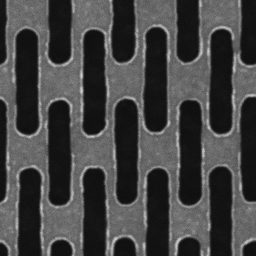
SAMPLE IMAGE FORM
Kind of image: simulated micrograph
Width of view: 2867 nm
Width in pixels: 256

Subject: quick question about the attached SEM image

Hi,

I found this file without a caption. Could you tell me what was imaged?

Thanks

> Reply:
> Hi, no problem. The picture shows holes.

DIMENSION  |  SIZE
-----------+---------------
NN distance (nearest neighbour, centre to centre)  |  0.714 µm